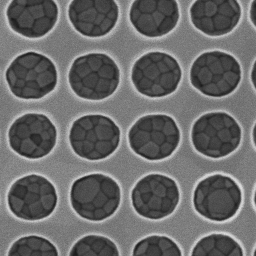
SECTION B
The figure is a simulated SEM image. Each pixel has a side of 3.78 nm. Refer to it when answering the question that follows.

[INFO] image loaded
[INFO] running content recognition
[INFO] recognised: a regular array of holes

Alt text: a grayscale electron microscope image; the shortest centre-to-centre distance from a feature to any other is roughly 226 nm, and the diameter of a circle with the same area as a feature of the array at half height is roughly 0.182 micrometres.